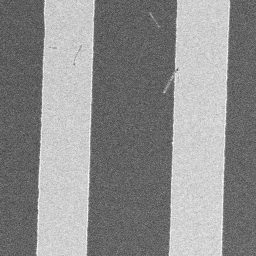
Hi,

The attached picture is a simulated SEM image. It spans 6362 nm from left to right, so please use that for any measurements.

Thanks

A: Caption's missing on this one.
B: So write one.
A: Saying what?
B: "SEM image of one or a few lines or trenches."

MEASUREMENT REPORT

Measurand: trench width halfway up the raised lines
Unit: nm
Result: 2070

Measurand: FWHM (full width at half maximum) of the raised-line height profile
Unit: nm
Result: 1250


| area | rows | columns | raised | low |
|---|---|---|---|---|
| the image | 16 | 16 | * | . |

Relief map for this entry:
...***.....***..
...***.....***..
...***.....***..
...***.....***..
...***.....***..
...***.....***..
...***.....***..
...***.....***..
...***.....***..
...***.....***..
..****.....***..
..****.....***..
..***......***..
..***......***..
..***......***..
..***......***..